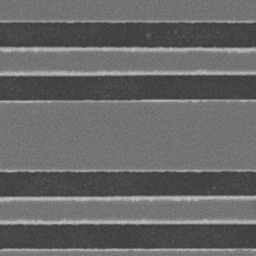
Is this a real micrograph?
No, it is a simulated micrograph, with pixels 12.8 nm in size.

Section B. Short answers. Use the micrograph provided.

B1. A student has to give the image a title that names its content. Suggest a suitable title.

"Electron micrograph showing lines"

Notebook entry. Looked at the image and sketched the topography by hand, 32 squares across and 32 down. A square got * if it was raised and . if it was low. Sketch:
********************************
********************************
********************************
................................
................................
................................
********************************
********************************
********************************
................................
................................
................................
................................
********************************
********************************
********************************
********************************
********************************
********************************
********************************
********************************
................................
................................
................................
................................
********************************
********************************
********************************
................................
................................
................................
********************************